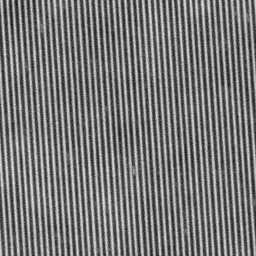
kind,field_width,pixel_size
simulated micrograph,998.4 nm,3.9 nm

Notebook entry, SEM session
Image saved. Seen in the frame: parallel lines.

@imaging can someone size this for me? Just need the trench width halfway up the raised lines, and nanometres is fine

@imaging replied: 16.6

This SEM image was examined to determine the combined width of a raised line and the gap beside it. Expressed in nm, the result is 23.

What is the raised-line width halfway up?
7.3 nm